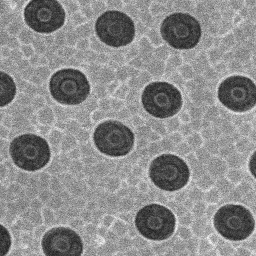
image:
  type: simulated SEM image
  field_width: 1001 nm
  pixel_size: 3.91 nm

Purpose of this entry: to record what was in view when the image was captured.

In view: a regular array of ring-shaped grooves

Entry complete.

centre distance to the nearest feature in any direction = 250 nm